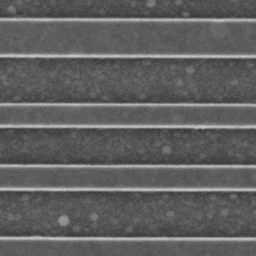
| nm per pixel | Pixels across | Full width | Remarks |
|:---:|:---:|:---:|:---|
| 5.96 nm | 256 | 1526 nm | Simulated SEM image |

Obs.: one or a few lines or trenches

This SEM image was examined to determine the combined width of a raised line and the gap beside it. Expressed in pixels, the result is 70.1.